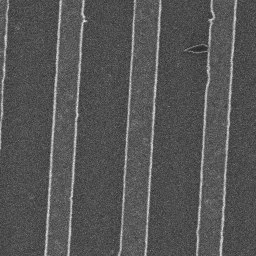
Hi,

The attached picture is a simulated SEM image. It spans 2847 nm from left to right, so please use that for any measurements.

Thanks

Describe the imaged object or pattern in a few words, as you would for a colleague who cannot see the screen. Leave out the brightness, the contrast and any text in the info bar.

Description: one or a few lines or trenches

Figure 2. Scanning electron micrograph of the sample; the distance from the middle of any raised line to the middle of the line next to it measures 842 nm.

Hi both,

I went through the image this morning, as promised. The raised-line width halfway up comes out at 272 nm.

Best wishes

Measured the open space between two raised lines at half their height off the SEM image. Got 576 nm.